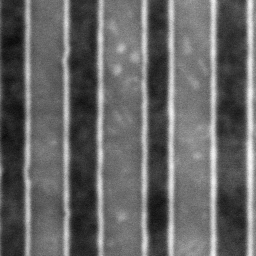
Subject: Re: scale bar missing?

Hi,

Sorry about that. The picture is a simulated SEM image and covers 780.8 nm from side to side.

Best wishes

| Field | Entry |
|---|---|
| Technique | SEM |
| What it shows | one or a few lines or trenches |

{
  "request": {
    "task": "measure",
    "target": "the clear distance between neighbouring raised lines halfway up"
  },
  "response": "124 nm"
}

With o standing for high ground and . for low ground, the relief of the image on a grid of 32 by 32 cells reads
ooo.....ooooo.....ooo......oooo.
ooo.....ooooo.....ooo......oooo.
ooo.....ooooo.....ooo......oooo.
ooo.....ooooo.....ooo......oooo.
ooo.....ooooo.....ooo......oooo.
ooo.....ooooo.....ooo......oooo.
ooo.....ooooo.....oooo.....oooo.
ooo.....ooooo.....oooo.....oooo.
ooo.....ooooo.....ooo......oooo.
ooo.....ooooo.....ooo......oooo.
ooo.....ooooo.....ooo......oooo.
ooo.....ooooo.....ooo......oooo.
oooo....ooooo.....ooo......oooo.
ooo.....ooooo.....ooo......oooo.
ooo.....ooooo.....ooo......oooo.
ooo.....ooooo.....ooo......oooo.
ooo.....ooooo.....ooo......oooo.
ooo.....ooooo.....ooo......oooo.
ooo.....ooooo.....ooo......oooo.
ooo.....ooooo.....ooo......oooo.
ooo.....ooooo.....ooo......oooo.
ooo.....ooooo.....ooo......oooo.
ooo.....ooooo.....ooo......oooo.
ooo.....ooooo.....ooo......oooo.
ooo.....ooooo.....ooo......oooo.
ooo.....ooooo.....ooo......oooo.
ooo.....ooooo.....ooo......oooo.
ooo.....ooooo.....ooo......oooo.
oooo....ooooo.....ooo......oooo.
ooo.....ooooo.....ooo......oooo.
ooo.....ooooo.....ooo......oooo.
ooo.....ooooo.....ooo......oooo.